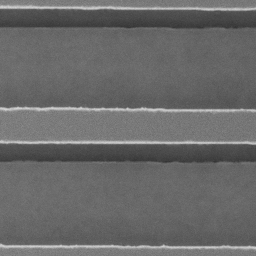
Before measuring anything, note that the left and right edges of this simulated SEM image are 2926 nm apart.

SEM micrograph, lines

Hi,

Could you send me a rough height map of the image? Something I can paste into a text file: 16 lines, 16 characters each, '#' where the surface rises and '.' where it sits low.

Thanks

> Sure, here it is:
################
................
................
................
................
................
................
################
################
................
................
................
................
................
................
################